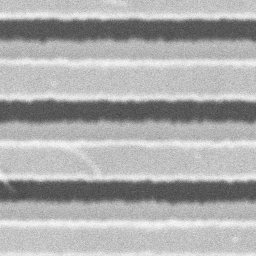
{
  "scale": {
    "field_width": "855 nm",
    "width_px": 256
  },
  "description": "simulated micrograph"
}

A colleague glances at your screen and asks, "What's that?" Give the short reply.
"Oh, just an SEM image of lines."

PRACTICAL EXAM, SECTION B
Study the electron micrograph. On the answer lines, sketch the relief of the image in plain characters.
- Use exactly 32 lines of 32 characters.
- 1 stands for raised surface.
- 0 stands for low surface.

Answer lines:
11111111111111111111111111111111
11111111111111111111111111111111
00000000000000000000000000000000
00000000000000000000000000000000
00000000000000000000000000000000
11111111111111111111111111111111
11111111111111111111111111111111
11111111111111111111111111111111
11111111111111111111111111111111
11111111111111111111111111111111
11111111111111111111111111111111
11111111111111111111111111111111
11110001111111111110011011111011
00000000000000000000000000000000
00000000000000000000000000000000
11111111111111111111111111111111
11111111111111111111111111111111
11111111111111111111111111111111
11111111111111111111111111111111
11111111111111111111111111111111
11111111111111111111111111111111
11111111111111111111111111111111
10000000000001000001110000001010
00000000000000000000000000000000
00000000000000000000000000000000
11111111111111111111101111111111
11111111111111111111111111111111
11111111111111111111111111111111
11111111111111111111111111111111
11111111111111111111111111111111
11111111111111111111111111111111
11111111111111111111111111111111